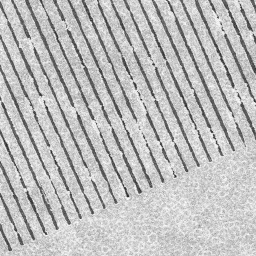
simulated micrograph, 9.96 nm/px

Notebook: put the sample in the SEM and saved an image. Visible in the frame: parallel lines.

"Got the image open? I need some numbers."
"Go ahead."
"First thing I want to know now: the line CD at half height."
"9.48 px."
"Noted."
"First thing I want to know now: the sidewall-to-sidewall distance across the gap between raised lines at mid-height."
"31.8 nanometers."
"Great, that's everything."